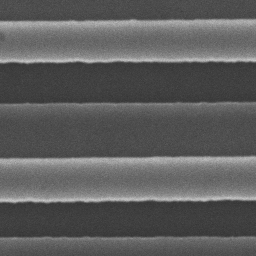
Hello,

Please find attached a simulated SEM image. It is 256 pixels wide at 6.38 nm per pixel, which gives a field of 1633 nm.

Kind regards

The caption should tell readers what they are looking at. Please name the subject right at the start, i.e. lines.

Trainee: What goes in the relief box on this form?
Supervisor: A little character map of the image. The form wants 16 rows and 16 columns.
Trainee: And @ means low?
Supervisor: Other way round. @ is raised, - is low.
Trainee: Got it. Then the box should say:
@@@@@@@@@@@@@@@@
@@@@@@@@@@@@@@@@
@@@@@@@@@@@@@@@@
@@@@@@@@@@@@@@@@
----------------
----------------
--------@@@@@@@@
@@@@@@@@@@@@@@@@
@@@@@@@@@@@@@@@@
@@@@@@@@@@@@@@@@
@@@@@@@@@@@@@@@@
@@@@@@@@@@@@@@@@
@@@@@@@@@@@@@@@@
----------------
----------------
@@@@@@@@@@@@@@@@